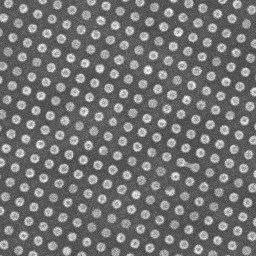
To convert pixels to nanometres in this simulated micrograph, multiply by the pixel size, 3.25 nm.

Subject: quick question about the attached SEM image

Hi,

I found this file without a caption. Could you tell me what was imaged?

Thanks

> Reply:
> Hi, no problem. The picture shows a regular array of raised bodies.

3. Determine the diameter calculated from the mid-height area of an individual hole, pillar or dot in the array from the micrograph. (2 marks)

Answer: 28.9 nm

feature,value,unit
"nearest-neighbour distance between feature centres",15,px